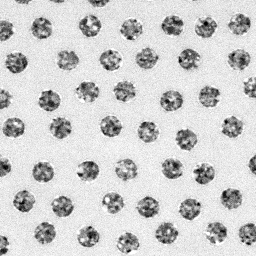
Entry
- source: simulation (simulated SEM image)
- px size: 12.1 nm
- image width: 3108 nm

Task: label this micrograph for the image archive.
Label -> a regular array of raised bodies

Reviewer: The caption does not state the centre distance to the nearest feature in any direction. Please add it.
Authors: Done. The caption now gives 34.9 px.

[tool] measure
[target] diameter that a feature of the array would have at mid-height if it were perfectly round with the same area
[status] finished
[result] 280 nanometres